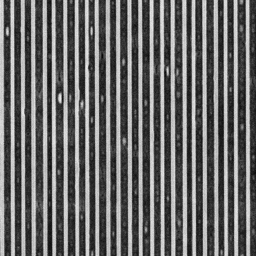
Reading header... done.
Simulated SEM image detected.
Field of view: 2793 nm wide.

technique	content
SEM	parallel lines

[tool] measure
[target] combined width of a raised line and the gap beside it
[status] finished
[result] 117 nm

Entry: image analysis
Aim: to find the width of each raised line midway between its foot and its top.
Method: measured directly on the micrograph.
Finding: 39.5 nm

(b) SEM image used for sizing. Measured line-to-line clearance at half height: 80.5 nm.